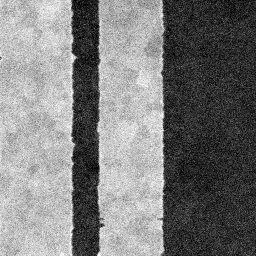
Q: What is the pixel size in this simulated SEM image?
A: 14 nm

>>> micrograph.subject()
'one or a few lines or trenches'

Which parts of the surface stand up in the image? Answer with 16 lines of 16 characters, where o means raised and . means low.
oooo..oooo......
oooo..oooo......
oooo..oooo......
ooooo.oooo......
oooo..oooo......
oooo..oooo......
oooo..oooo......
oooo..oooo......
oooo..oooo......
ooooo.oooo......
oooo..oooo......
oooo..oooo......
oooo..oooo......
oooo..oooo......
oooo..oooo......
oooo..oooo......